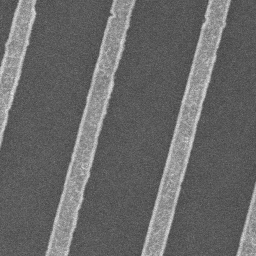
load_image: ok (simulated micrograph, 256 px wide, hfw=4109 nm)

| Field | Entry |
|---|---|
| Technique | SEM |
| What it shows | one or a few lines or trenches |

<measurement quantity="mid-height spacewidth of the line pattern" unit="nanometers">1200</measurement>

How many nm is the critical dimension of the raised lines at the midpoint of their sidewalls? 290